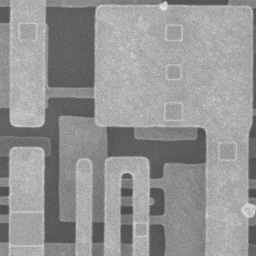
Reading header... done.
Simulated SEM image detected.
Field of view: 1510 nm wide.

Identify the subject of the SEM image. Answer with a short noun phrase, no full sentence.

wiring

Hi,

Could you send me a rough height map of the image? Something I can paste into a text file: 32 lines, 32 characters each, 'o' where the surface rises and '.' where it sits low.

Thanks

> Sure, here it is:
.ooooo..............o...........
.ooooo......oooooooooooooooooooo
.ooooo......oooooooooooooooooooo
.ooooo......oooooooooooooooooooo
.ooooo......oooooooooooooooooooo
.ooooo......oooooooooooooooooooo
.oooo.......oooooooooooooooooooo
.oooo.......oooooooooooooooooooo
.oooo.......oooooooooooooooooooo
.ooooo......oooooooooooooooooooo
.ooooo......oooooooooooooooooooo
.oooo.......oooooooooooooooooooo
.oooo.......oooooooooooooooooooo
.oooo.......oooooooooooooooooooo
.oooo.......oooooooooooooooooooo
..ooo.......ooooooooooooooooooo.
..........................ooooo.
..........................ooooo.
..ooo.....................ooooo.
.oooo.....................ooooo.
.oooo.....o..oooooo.......ooooo.
.oooo.....o..oooooo.......ooooo.
.oooo.....o..oo..oo.......ooooo.
.oooo.....o..oo..oo.......ooooo.
.oooo.....o..oo..oo.......ooooo.
.oooo.....o..oo..oo.......ooooo.
.oooo.....o..oo..oo.......oooooo
.oooo.....o..oo..oo.......ooooo.
.oooo.....o..oo..oo.......ooooo.
.oooo.....o..oo..oo.......ooooo.
.oooo.....o..oo..oo.......ooooo.
.oooo.....o..oo..oo.......ooooo.